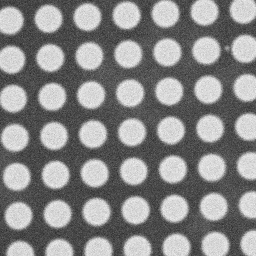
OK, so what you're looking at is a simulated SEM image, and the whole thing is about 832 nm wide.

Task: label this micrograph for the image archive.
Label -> an array of small figures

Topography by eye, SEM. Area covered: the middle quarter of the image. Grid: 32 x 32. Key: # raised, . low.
....####.......##...............
................................
................................
................................
...............###......####....
.....####.....#####....######...
....######...#######...######...
....######...#######...######...
....######...#######....#####...
....#####.....#####.....####....
.....###........................
................................
................................
..........................#.....
......##.......####.....#####...
.....#####....######....######..
....######....######....######..
#...######....######....######..
#...######....######....#####...
.....#####.....####.......##....
......##........................
................................
................................
..........................###...
......###......####......#####..
.....#####....######....######..
#....######...######....######..
#....######...######....######..
#....######....#####.....#####..
#....#####......###.......##....
................................
................................